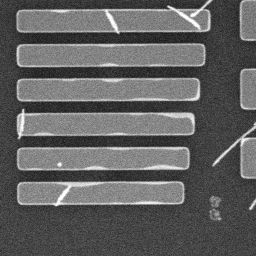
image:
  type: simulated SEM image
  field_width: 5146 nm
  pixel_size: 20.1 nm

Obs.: groups of lines, slits or small figures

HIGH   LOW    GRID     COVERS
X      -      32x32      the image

------------------------------XX
--XXXXXXXXXXXXXXXXXXXXXXXX----XX
--XXXXXXXXXXXXXXXXXXXXXXXX----XX
--XXXXXXXXXXXXXXXXXXXXXXXX----XX
------------------------------XX
--------------------------------
--XXXXXXXXXXXXXXXXXXXXXXXX------
--XXXXXXXXXXXXXXXXXXXXXXXX------
--------------------------------
------------------------------XX
--XXXXXXXXXXXXXXXXXXXXXXX-----XX
--XXXXXXXXXXXXXXXXXXXXXXX-----XX
---XXXXXXXXXXXXXX----XX-------XX
-------------------------------X
--XXXXXXXXXXXXXXXXXXXXXX--------
--XXXXXXXXXXXXXXXXXXXXXX--------
--XXXXXXXXXXXXXXXXXXXXXX--------
-------------------------------X
------------------------------XX
--XXXXXXXXXXXXXXXXXXXXXX------XX
--XXXXXXXXXXXXXXXXXXXXXX------XX
------------------------------XX
--------------------------------
--XXXXXXXXXXXXXXXXXXXXX---------
--XXXXXXXXXXXXXXXXXXXXX---------
------XX------------------------
--------------------------------
--------------------------------
--------------------------------
--------------------------------
--------------------------------
--------------------------------